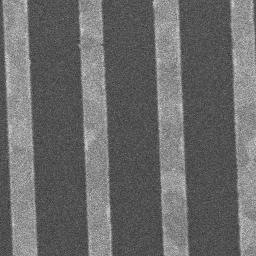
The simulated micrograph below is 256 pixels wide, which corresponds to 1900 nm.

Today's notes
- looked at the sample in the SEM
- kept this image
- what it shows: one or a few lines or trenches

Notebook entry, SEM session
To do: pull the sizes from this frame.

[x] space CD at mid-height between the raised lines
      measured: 397 nanometers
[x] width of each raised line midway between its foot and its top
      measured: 167 nm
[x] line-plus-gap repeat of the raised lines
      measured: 0.56 microns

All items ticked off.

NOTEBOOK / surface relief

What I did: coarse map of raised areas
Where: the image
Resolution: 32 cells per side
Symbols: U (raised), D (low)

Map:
DUUDDDDDDDUUUDDDDDDUUUDDDDDDDUUU
DUUDDDDDDDUUUDDDDDDUUUDDDDDDDUUU
DUUDDDDDDDUUUDDDDDDUUUDDDDDDDUUU
DUUDDDDDDDUUUDDDDDDUUUDDDDDDDUUU
DUUDDDDDDDUUUDDDDDDUUUDDDDDDDUUU
DUUDDDDDDDUUUDDDDDDUUUDDDDDDDUUU
DUUDDDDDDDUUUDDDDDDDUUDDDDDDDUUU
DUUUDDDDDDUUUDDDDDDDUUDDDDDDDUUU
DUUUDDDDDDUUUDDDDDDDUUDDDDDDDUUU
DUUUDDDDDDUUUDDDDDDDUUDDDDDDDUUU
DUUUDDDDDDUUUDDDDDDDUUUDDDDDDUUU
DUUUDDDDDDUUUDDDDDDDUUUDDDDDDUUU
DUUUDDDDDDDUUDDDDDDDUUUDDDDDDUUU
DUUUDDDDDDDUUDDDDDDDUUUDDDDDDUUU
DUUUDDDDDDDUUDDDDDDDUUUDDDDDDUUU
DUUUDDDDDDDUUDDDDDDDUUUDDDDDDUUU
DUUUDDDDDDDUUDDDDDDDUUUDDDDDDUUU
DUUUDDDDDDDUUDDDDDDDUUUDDDDDDDUU
DUUUDDDDDDDUUDDDDDDDUUUDDDDDDDUU
DUUUDDDDDDDUUDDDDDDDUUUDDDDDDDUU
DUUUDDDDDDDUUDDDDDDDUUUDDDDDDDUU
DUUUDDDDDDDUUDDDDDDDUUUDDDDDDDUU
DUUUDDDDDDDUUUDDDDDDUUUDDDDDDDUU
DUUUDDDDDDDUUUDDDDDDUUUDDDDDDDUU
DUUUDDDDDDDUUUDDDDDDUUUDDDDDDDUU
DUUUDDDDDDDUUUDDDDDDUUUDDDDDDDUU
DUUUDDDDDDDUUUDDDDDDUUUDDDDDDDUU
DUUUDDDDDDDUUUDDDDDDUUUDDDDDDDUU
DDUUDDDDDDDUUUDDDDDDUUUDDDDDDDUU
DDUUDDDDDDDUUUDDDDDDUUUDDDDDDDUU
DDUUDDDDDDDUUUDDDDDDDUUDDDDDDDUU
DDUUDDDDDDDUUUDDDDDDDUUDDDDDDDUU